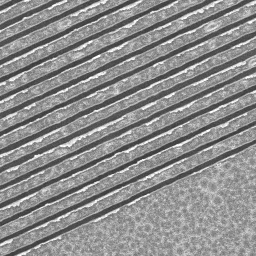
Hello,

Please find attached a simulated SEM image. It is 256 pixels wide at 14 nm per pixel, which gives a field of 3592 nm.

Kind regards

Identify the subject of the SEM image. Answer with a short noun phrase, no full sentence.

parallel lines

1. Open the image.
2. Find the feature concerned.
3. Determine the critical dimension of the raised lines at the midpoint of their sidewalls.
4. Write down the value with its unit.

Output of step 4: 157 nm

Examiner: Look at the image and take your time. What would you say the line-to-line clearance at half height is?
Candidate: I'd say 0.0731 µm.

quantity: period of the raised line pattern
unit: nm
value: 228